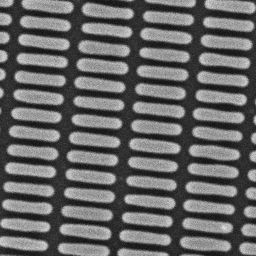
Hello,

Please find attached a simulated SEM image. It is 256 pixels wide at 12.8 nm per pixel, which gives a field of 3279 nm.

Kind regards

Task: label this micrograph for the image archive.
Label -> groups of lines, slits or small figures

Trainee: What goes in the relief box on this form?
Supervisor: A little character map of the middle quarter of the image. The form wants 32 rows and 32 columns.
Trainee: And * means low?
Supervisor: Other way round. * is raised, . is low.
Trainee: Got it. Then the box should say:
...*************................
....************..************..
...................************.
....**.................********.
...**********...................
...************...******........
..........*****...************..
...................***********..
...***....................****..
...************.................
....***********..***********....
............**...*************..
.......................*******..
..*********.....................
..************...*****..........
......********...************...
.................************...
..****...................****...
.************...................
..************...********.......
...........**....************...
...................**********..*
.********.......................
.************....***............
....*********...***********.....
.................***********...*
.***...................*****...*
.***********....................
.************...******..........
......******....************....
..................**********...*
*****..........................*